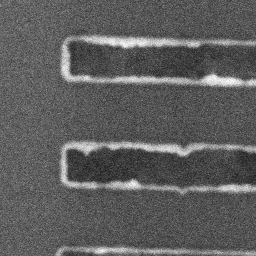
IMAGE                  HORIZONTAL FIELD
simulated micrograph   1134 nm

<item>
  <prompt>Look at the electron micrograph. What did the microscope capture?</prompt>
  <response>one or a few lines or trenches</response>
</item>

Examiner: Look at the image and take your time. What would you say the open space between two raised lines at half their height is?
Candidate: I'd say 275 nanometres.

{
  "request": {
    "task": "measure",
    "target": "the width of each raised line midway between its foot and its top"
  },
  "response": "0.188 um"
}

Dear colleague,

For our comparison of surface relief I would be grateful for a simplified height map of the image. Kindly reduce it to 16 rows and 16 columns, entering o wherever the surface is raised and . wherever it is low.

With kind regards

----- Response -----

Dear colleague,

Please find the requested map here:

................
................
....oooooo......
....oooooooooooo
....oooooooooooo
................
................
................
................
....oooooooooooo
....oooooooooooo
....oooooooooooo
................
................
................
................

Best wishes